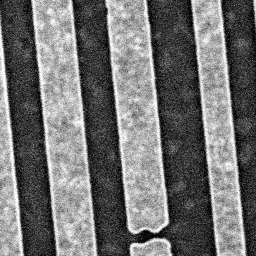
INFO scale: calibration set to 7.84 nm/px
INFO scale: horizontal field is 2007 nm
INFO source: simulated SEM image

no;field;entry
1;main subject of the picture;one or a few lines or trenches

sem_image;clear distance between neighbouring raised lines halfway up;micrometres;0.278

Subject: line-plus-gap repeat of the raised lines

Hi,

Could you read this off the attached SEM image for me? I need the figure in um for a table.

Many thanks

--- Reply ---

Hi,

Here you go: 0.601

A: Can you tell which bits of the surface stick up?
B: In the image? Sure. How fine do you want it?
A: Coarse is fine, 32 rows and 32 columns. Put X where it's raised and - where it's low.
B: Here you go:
----XXXXX----XXXXX------XXX-----
----XXXXX-----XXXX------XXXX----
----XXXXX-----XXXX------XXXX----
----XXXXX-----XXXXX-----XXXX----
-----XXXX-----XXXXX-----XXXX----
-----XXXX-----XXXXX------XXX----
-----XXXX-----XXXXX------XXX----
-----XXXXX----XXXXX------XXX----
-----XXXXX----XXXXX------XXX----
X----XXXXX----XXXXX------XXX----
X----XXXXX----XXXXX------XXX----
X----XXXXX----XXXXX------XXXX---
X----XXXXX-----XXXX------XXXX---
X----XXXXX-----XXXXX-----XXXX---
X-----XXXX-----XXXXX-----XXXX---
X-----XXXX-----XXXXX------XXX---
X-----XXXX-----XXXXX------XXX---
X-----XXXXX----XXXXX------XXX---
X-----XXXXX----XXXXX------XXX---
XX----XXXXX----XXXXX------XXX---
XX----XXXXX----XXXXX------XXX---
XX----XXXXX----XXXXX------XXXX--
XX----XXXXX----XXXXX------XXXX--
XX----XXXXX-----XXXXX-----XXXX--
XX-----XXXX-----XXXXX-----XXXX--
XX-----XXXX-----XXXXX------XXX--
XX-----XXXX-----XXXXX------XXX--
XX-----XXXXX----XXXXX------XXX--
XX-----XXXXX----XXXX-------XXX--
XXX----XXXXX---------------XXX--
XXX----XXXXX------XXX------XXX--
XXX----XXXXX----XXXXX------XXXX-